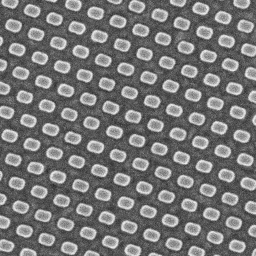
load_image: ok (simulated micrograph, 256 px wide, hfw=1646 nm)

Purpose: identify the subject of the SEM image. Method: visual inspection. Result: a regular array of raised bodies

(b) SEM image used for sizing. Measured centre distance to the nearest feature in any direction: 153 nanometers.